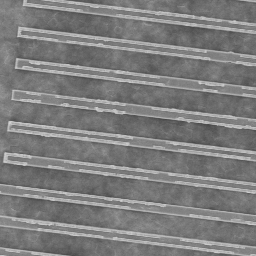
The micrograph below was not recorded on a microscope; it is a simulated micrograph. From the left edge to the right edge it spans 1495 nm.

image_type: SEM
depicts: parallel lines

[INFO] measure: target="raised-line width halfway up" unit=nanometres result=60.9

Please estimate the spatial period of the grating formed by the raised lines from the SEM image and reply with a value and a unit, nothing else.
185 nm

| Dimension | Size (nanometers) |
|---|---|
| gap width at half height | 127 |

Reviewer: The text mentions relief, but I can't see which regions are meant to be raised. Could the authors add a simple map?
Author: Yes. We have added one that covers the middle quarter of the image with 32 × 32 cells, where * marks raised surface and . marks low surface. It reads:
****............................
***********.....................
*******************.............
.........******************.....
................****************
.........................*******
................................
................................
***.............................
*************...................
********************............
........**********************..
..............*.****************
........................********
...............................*
................................
**..............................
***********.....................
*******************.............
.........******************.....
.................***************
.........................*******
................................
................................
***.............................
*************...................
.*******************............
.........*******************....
..................**************
..........................******
................................
................................